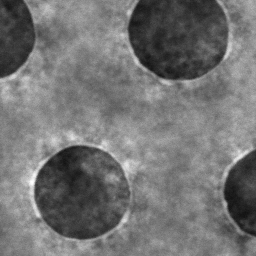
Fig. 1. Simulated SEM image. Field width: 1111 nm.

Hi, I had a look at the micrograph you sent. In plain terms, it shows holes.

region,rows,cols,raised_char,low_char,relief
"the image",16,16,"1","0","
0011111100000011
0011111100000011
0011111100000011
0011111100000011
0111111110000111
1111111111111111
1111111111111111
1111111111111111
1111111111111111
1111000111111111
1110000011111100
1100000011111100
1100000011111100
1110000011111100
1110000111111110
1111111111111111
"